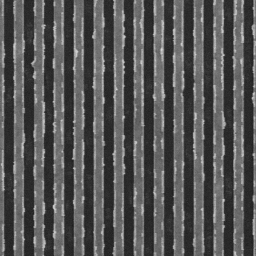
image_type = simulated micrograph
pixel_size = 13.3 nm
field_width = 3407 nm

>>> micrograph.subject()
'parallel lines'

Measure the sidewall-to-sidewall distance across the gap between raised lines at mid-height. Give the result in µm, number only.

0.14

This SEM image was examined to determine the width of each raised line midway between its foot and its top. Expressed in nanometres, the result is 128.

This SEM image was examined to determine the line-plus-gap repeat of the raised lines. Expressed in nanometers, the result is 265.